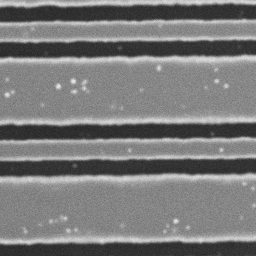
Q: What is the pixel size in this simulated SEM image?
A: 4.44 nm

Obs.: lines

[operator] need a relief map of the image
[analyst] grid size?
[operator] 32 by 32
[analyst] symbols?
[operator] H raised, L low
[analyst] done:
HHHHHHHHHHHHHHHHHHHHHHHHHHHLLLHH
LLLLLLLLLLLLLLLLLLLLLLLLLLLLLLLL
LLLLLLLLLLLLLLLLLLLLLLLLLLLLLLHL
HHHHHHHHHHHHHHHHHHHHHHHHHHHHHHHH
HHHHHHHHHHHHHHHHHHHHHHHHHHHHHHHH
LLLLLLLLLLLLLLLLLLLLLLLLLLLLLLLL
LLLLLLLLLLLLLLLLLLLLLLLLLLLLLLLL
HHHHHHHHHHHHHHHHHHHHHHHHHHHHHHHH
HHHHHHHHHHHHHHHHHHHHHHHHHHHHHHHH
HHHHHHHHHHHHHHHHHHHHHHHHHHHHHHHH
HHHHHHHHHHHHHHHHHHHHHHHHHHHHHHHH
HHHHHHHHHHHHHHHHHHHHHHHHHHHHHHHH
HHHHHHHHHHHHHHHHHHHHHHHHHHHHHHHH
HHHHHHHHHHHHHHHHHHHHHHHHHHHHHHHH
HHHHHHHHHHHHHHHHHHHHHHHHHHHHHHHH
HHHHHHHHHHHHHHHHLLLLLLLLLLLLLLLL
LLLLLLLLLLLLLLLLLLLLLLLLLLLLLLLL
LLLLLHLLLLHLHHHHHHHHHHHHHHHHHHHH
HHHHHHHHHHHHHHHHHHHHHHHHHHHHHHHH
HHHHHHHHHHHHHHHHHHHHHHHHHHHHHHHH
LLLLLLLLLLLLLLLLLLLLLLLLLLLLLLLL
LLLLLLLLLLLLLLLLLLLLLLLLLLLLLLLL
HHHHHHHHHHHHHHHHHHHHHHHHHHHHHHHH
HHHHHHHHHHHHHHHHHHHHHHHHHHHHHHHH
HHHHHHHHHHHHHHHHHHHHHHHHHHHHHHHH
HHHHHHHHHHHHHHHHHHHHHHHHHHHHHHHH
HHHHHHHHHHHHHHHHHHHHHHHHHHHHHHHH
HHHHHHHHHHHHHHHHHHHHHHHHHHHHHHHH
HHHHHHHHHHHHHHHHHHHHHHHHHHHHHHHH
HHHHHHHHHHHHHHHHHHHHHHHHHHHHHHHH
LLLLLLLLLLLLLLLLLLLLLLLLLLLLLLLL
LLLLLLLLLLLLLLLLLLLLLLLLLLLLLLLL